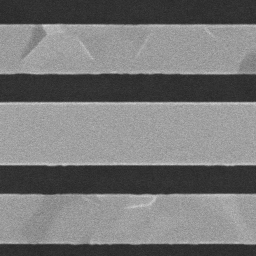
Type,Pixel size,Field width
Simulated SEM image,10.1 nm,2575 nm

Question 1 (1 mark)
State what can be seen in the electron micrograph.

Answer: lines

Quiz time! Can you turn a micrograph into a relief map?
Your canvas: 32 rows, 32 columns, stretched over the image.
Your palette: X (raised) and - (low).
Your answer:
--------------------------------
--------------------------------
--------------------------------
XXXXXXXXXXXXXXXXXXXXXXXXXXXXXXXX
XXXXXXXXXXXXXXXXXXXXXXXXXXXXXXXX
XXXXXXXXXXXXXXXXXXXXXXXXXXXXXXXX
XXXXXXXXXXXXXXXXXXXXXXXXXXXXXXXX
XXXXXXXXXXXXXXXXXXXXXXXXXXXXXXXX
XXXXXXXXXXXXXXXXXXXXXXXXXXXXXXXX
--------------------------------
--------------------------------
--------------------------------
--------------------------------
XXXXXXXXXXXXXXXXXXXXXXXXXXXXXXXX
XXXXXXXXXXXXXXXXXXXXXXXXXXXXXXXX
XXXXXXXXXXXXXXXXXXXXXXXXXXXXXXXX
XXXXXXXXXXXXXXXXXXXXXXXXXXXXXXXX
XXXXXXXXXXXXXXXXXXXXXXXXXXXXXXXX
XXXXXXXXXXXXXXXXXXXXXXXXXXXXXXXX
XXXXXXXXXXXXXXXXXXXXXXXXXXXXXXXX
XXXXXXXXXXXXXXXXXXXXXXXXXXXXXXXX
--------------------------------
--------------------------------
--------------------------------
XXXXXXXXXXXXXXXXXXXXXXXXXXXXXXXX
XXXXXXXXXXXXXXXXXXXXXXXXXXXXXXXX
XXXXXXXXXXXXXXXXXXXXXXXXXXXXXXXX
XXXXXXXXXXXXXXXXXXXXXXXXXXXXXXXX
XXXXXXXXXXXXXXXXXXXXXXXXXXXXXXXX
XXXXXXXXXXXXXXXXXXXXXXXXXXXXXXXX
---------X--X----X-------------X
--------------------------------